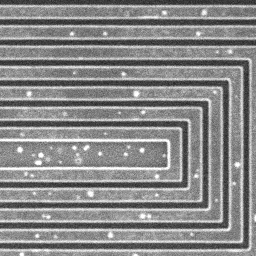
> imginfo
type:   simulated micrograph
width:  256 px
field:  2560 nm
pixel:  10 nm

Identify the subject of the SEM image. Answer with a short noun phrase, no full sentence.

groups of lines, slits or small figures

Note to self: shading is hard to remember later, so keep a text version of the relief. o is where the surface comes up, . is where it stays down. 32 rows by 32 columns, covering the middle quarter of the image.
................................
oooooooooooooooooooooooooooooooo
oooooooooooooooooooooooooooooooo
oooooooooooooooooooooooooooooooo
................................
................................
oooooooooooooooooooooooooooooooo
oooooooooooooooooooooooooooooooo
oooooooooooooooooooooooooooooooo
................................
................................
oooooooooooooooooooooooooooooooo
oooooooooooooooooooooooooooooooo
oooooooooooooooooooooooooooooooo
...............................o
...............................o
ooooooooooooooooooooooooooooo..o
ooooooooooooooooooooooooooooo..o
ooooooooooooooooooooooooooooo..o
..........................ooo..o
..........................ooo..o
..........................ooo..o
..........................ooo..o
..........................ooo..o
..........................ooo..o
..........................ooo..o
ooooooooooooooooooooooooooooo..o
ooooooooooooooooooooooooooooo..o
ooooooooooooooooooooooooooooo..o
...............................o
...............................o
oooooooooooooooooooooooooooooooo